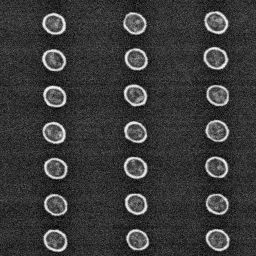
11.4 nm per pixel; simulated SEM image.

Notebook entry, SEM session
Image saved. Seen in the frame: a regular array of raised bodies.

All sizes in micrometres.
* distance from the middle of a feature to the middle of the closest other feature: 0.409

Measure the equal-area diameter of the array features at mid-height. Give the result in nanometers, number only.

236